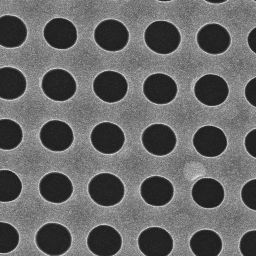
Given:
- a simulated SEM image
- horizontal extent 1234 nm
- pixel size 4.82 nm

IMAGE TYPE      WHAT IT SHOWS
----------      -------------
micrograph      a regular array of holes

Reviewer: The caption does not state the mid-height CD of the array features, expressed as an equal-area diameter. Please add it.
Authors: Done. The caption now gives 156 nanometres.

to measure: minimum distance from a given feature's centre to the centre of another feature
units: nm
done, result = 245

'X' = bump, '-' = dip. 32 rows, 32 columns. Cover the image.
XXXXXXXXXXXXXXXXXXXXXXXXXXXXXXXX
XXXXXXXXXXXXXXXXXXXXXXXXXXXXXXXX
---XXX--XXXXX-XXXXXXXXXXXXXXXXXX
---XXX---XXX----XX----XXX---XXXX
---XXX----XX----XX----XXX----XX-
---XXX---XXX----XX----XXX----XX-
XXXXXXXXXXXXXXXXXXX--XXXXX--XXXX
XXXXXXXXXXXXXXXXXXXXXXXXXXXXXXXX
--XXXXXXXXXXXXXXXXXXXXXXXXXXXXXX
---XXX---XXX---XXXX--XXXX--XXXXX
---XX----XXX----XX----XXX---XXX-
---XXX---XXX----XX----XX-----XX-
XXXXXXX-XXXXX--XXXX--XXXX---XXX-
XXXXXXXXXXXXXXXXXXXXXXXXXXXXXXXX
XXXXXXXXXXXXXXXXXXXXXXXXXXXXXXXX
--XXXX--XXXX--XXXXXXXXXXXXXXXXXX
---XX----XX----XXX----XXX---XXX-
---XX----XX----XXX----XX----XXX-
--XXXX--XXXX---XXX----XX----XXX-
XXXXXXXXXXXXXXXXXXXXXXXXXX-XXXXX
XXXXXXXXXXXXXXXXXXXXXXXXXXXXXXXX
--XXXXXXXXXXXXXXXXXXXXXXXXXXXXXX
--XXX----XXX---XXX---XXXX--XXXXX
---XX----XX----XXX----XX----XX--
--XXX----XX----XXX----XX----XX--
XXXXXXXXXXXX--XXXXX--XXXX---XXX-
XXXXXXXXXXXXXXXXXXXXXXXXXXXXXXXX
XXXXXXXXXXXXXXXXXXXXXXXXXXXXXXXX
--XXX---XXXX--XXXXX-XXXXXXXXXXXX
--XXX----XX----XX----XXX---XXX--
--XXX----XX----XX-----XX----XX--
-XXXXX--XXXX---XXX---XXX---XXX--